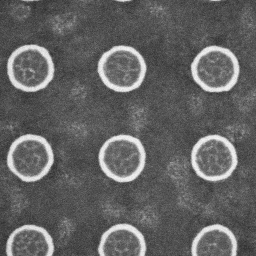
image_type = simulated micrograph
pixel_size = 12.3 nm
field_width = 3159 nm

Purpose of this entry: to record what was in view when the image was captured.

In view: raised bodies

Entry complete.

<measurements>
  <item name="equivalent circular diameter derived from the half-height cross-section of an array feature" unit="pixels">42.4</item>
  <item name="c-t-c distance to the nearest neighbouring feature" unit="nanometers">1100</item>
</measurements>